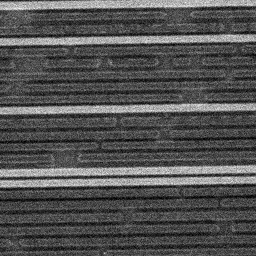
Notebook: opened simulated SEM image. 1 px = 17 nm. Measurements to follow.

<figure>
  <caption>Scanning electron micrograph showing parallel lines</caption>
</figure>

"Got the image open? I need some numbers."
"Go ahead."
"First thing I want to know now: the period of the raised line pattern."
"0.202 µm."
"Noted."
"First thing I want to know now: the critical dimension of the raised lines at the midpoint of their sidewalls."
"115 nanometers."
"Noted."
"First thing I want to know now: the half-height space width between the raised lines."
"4.87 px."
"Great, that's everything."